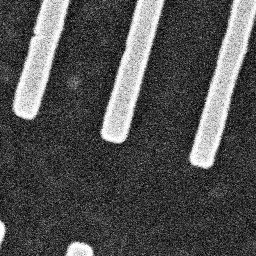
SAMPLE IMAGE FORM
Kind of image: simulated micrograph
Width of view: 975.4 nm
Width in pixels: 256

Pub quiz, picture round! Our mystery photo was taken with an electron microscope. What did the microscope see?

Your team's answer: one or a few lines or trenches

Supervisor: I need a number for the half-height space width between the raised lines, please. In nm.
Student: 271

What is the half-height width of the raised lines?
80.8 nanometres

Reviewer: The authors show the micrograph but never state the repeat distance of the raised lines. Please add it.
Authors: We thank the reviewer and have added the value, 349 nm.